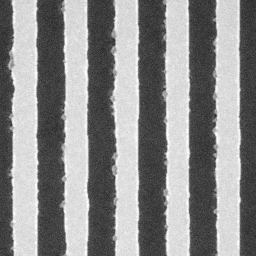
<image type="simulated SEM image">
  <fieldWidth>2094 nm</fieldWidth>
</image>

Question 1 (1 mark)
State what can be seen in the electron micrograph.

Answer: lines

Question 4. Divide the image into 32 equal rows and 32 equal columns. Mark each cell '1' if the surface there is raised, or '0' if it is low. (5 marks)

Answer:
00111000111000111000011000011100
00111000111000011000011000011100
00111000111000111000011000011100
00111000111000111000011000011100
00111000111000111000011000011100
00110000111000111000011000011100
01111000111000111000011000011100
01111000111000111000011000011100
01111000111000111000011100011100
00111000111000111000011100011100
00111000111000111000011100011100
00110000111000111000011100011100
00111000111000111000011100011100
00111000111000111000011100011100
01111000111000111000011000011100
00111000111000011000011000011100
00111000111000111000011000011100
00111000111000011000011000011100
00111000111000011000011100011100
00111000111000111000011100011100
00111000111000111000011000011100
01111000111000111000011000011100
00111000111000011000011000011100
00111000111000011000011000011100
00111000111000011000011100011100
00111000111000111000011000011100
00111000111000111000011100011100
01111000111000011000011100011100
00111000111000111000011100011100
00111000111000111000011100011100
00111000111000111000011100011100
00111000111000011000011100011100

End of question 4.